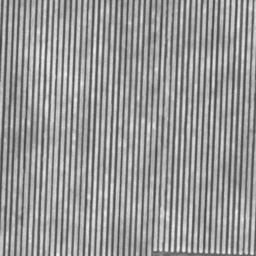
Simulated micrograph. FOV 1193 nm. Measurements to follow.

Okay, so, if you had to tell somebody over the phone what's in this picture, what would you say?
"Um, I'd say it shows parallel lines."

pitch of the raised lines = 26.6 nm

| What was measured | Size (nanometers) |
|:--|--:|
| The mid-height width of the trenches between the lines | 12.2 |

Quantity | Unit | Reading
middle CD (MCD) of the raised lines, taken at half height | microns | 0.0157